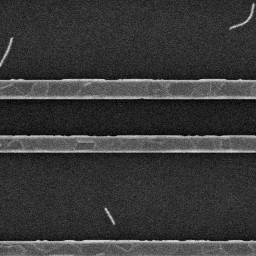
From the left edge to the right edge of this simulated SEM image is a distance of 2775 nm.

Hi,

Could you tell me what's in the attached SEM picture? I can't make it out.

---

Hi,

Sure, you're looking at lines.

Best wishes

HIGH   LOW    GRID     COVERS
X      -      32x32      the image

--------------------------------
--------------------------------
--------------------------------
--------------------------------
--------------------------------
--------------------------------
--------------------------------
--------------------------------
--------------------------------
--------------------------------
XXXXXXXXXXXXXXXXXXXXXXXXXXXXXXXX
XXXXXXXXXXXXXXXXXXXXXXXXXXXXXXXX
--------------------------------
--------------------------------
--------------------------------
--------------------------------
--------------------------------
XXXXXXXXXXXXXXXXXXXXXXXXXXXXXXXX
XXXXXXXXXXXXXXXXXXXXXXXXXXXXXXXX
--------------------------------
--------------------------------
--------------------------------
--------------------------------
--------------------------------
--------------------------------
--------------------------------
--------------------------------
--------------------------------
--------------------------------
--------------------------------
XXXXXXXXXXXXXXXXXXXXXXXXXXXXXXXX
XXXXXXXXXXXXXXXXXXXXXXXXXXXXXXXX